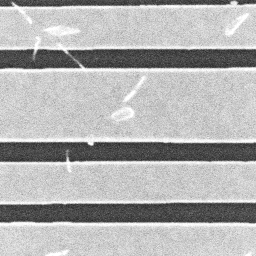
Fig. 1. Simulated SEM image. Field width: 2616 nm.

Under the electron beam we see lines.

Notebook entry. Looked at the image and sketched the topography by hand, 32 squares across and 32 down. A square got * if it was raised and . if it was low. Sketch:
................................
********************************
********************************
********************************
********************************
********************************
................................
................................
................................
********************************
********************************
********************************
********************************
********************************
********************************
********************************
********************************
********************************
................................
................................
********************************
********************************
********************************
********************************
********************************
................................
................................
................................
********************************
********************************
********************************
********************************